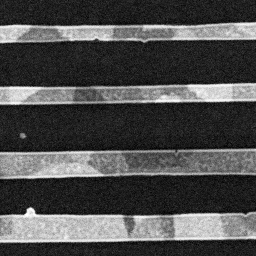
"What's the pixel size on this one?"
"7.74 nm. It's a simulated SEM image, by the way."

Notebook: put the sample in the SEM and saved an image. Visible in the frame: one or a few lines or trenches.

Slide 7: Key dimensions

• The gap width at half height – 0.362 µm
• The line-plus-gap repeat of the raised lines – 502 nm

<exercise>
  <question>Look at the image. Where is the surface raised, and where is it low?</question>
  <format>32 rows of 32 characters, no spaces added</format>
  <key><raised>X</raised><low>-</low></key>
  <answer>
--------------------------------
--------------------------------
--------------------------------
XXXXXXXXXXXXXXXXXXXXXXXXXXXXXXXX
XXXXXXXXXXXXXXXXXXXXXXXXXXXXXXXX
--------------------------------
--------------------------------
--------------------------------
--------------------------------
--------------------------------
--------------------------------
XXXXXXXXXXXXXXXXXXXXXXXXXXXXXXXX
XXXXXXXXXXXXXXXXXXXXXXXXXXX-----
--------------------------------
--------------------------------
--------------------------------
--------------------------------
--------------------------------
--------------------------------
XXXXXXXXXXXXXXXXXXXXXXXXXXXXXXXX
XXXXXXXXXXXXXXXXXXXXXXXXXXXXXXXX
XXXXXXXXXXXXXXXXXXXXXXXXXXXXXXXX
--------------------------------
--------------------------------
--------------------------------
--------------------------------
---X----------------------------
XXXXXXXXXXXXXXXXXXXXXXXXXXXXXXXX
XXXXXXXXXXXXXXXXXXXXXXXXXXXXXXXX
XXXXXXXXXXXXXXXXXXXXXXXXXXXXXXXX
--------------------------------
--------------------------------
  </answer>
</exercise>